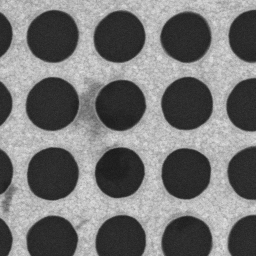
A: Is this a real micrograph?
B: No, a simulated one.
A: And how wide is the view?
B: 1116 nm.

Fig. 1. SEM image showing a regular array of holes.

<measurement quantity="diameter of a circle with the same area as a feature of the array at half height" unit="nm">224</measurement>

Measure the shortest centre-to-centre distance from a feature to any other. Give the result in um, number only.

0.291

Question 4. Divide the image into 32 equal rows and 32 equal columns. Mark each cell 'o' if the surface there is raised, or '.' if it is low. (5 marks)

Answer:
oooooooooooooooooooooooooooooooo
oooooo..oooooo..ooooooo.ooooooo.
.ooo.....oooo....oooo.....ooo...
.ooo......oo......oo......ooo...
..o.......oo......oo......ooo...
.oo.......oo......oo......ooo...
.ooo.....ooo.....oooo.....ooo...
ooooo...ooooo...oooooo...ooooo..
oooooooooooooooooooooooooooooooo
oooooooooooooooooooooooooooooooo
ooooo....ooooo...oooo.....oooo..
.ooo......oo......ooo.....ooo...
.oo.......oo......oo.......o....
.oo.......oo......oo.......o....
.oo......ooo......ooo.....ooo...
oooo.....oooo....oooo....oooo...
oooooooooooooooooooooooooooooooo
oooooooooooooooooooooooooooooooo
oooooo..oooooo..ooooooooooooooo.
.ooo.....oooo....oooo.....ooo...
..oo......oo......oo......ooo...
..o.......oo......oo......oo....
.oo.......oo......oo......ooo...
.ooo.....ooo.....oooo.....ooo...
ooooo...oooooo..oooooo...ooooo..
oooooooooooooooooooooooooooooooo
oooooooooooooooooooooooooooooooo
ooooo...ooooo....ooooo...ooooo..
.ooo.....oooo.....ooo.....ooo...
..o.......oo......oo......ooo...
..o.......oo......oo.......oo...
.ooo.....ooo......oo......ooo...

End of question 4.